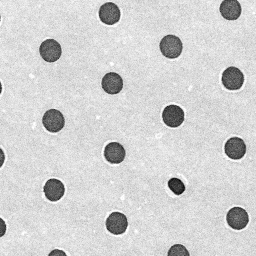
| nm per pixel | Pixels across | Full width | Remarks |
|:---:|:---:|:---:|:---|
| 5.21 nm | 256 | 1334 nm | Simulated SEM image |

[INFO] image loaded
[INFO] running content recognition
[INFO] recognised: a regular array of holes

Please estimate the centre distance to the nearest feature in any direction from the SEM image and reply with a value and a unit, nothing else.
360 nanometres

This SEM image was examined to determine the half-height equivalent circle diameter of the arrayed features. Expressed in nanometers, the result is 118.